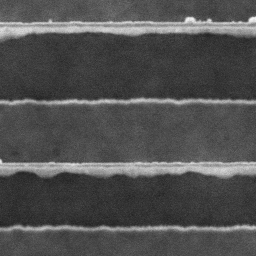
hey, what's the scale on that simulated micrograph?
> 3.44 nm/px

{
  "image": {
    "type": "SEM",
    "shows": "lines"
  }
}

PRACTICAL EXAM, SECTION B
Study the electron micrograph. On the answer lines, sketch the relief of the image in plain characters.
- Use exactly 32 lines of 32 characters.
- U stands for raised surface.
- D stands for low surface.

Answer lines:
UUUUUUUUUUUUUUUUUUUUUUUUUUUUUUUU
UUUUUUUUUUUUUUUUUUUUUUUUUUUUUUUU
UUUUUUUUUUUUUUUUUUUUUUUUUUUUUUUU
UUUUUUUUUUUUUUUUUUUUUUUUUUUUUUUU
DDDDDDDDDDDDDDDDDDDDDDDDDDDDDDDD
DDDDDDDDDDDDDDDDDDDDDDDDDDDDDDDD
DDDDDDDDDDDDDDDDDDDDDDDDDDDDDDDD
DDDDDDDDDDDDDDDDDDDDDDDDDDDDDDDD
DDDDDDDDDDDDDDDDDDDDDDDDDDDDDDDD
DDDDDDDDDDDDDDDDDDDDDDDDDDDDDDDD
DDDDDDDDDDDDDDDDDDDDDDDDDDDDDDDD
DDDDDDDDDDDDDDDDDDDDDDDDDDDDDDDD
DDDDDDDDDDDDDDDDDDDDDDDDDDDDDDDD
UUUUUUUUUUUUUUUUUUUUUUUUUUUUUUUU
UUUUUUUUUUUUUUUUUUUUUUUUUUUUUUUU
UUUUUUUUUUUUUUUUUUUUUUUUUUUUUUUU
UUUUUUUUUUUUUUUUUUUUUUUUUUUUUUUU
UUUUUUUUUUUUUUUUUUUUUUUUUUUUUUUU
UUUUUUUUUUUUUUUUUUUUUUUUUUUUUUUU
UUUUUUUUUUUUUUUUUUUUUUUUUUUUUUUU
UUUUUUUUUUUUUUUUUUUUUUUUUUUUUUUU
DDDDDDDDDDDDDDDDDDDDDDDDDDDDDDDD
DDDDDDDDDDDDDDDDDDDDDDDDDDDDDDDD
DDDDDDDDDDDDDDDDDDDDDDDDDDDDDDDD
DDDDDDDDDDDDDDDDDDDDDDDDDDDDDDDD
DDDDDDDDDDDDDDDDDDDDDDDDDDDDDDDD
DDDDDDDDDDDDDDDDDDDDDDDDDDDDDDDD
DDDDDDDDDDDDDDDDDDDDDDDDDDDDDDDD
DDUDDDDDDDDDDDDDDDDDDUDDDDDDDUUU
UUUUUUUUUUUUUUUUUUUUUUUUUUUUUUUU
UUUUUUUUUUUUUUUUUUUUUUUUUUUUUUUU
UUUUUUUUUUUUUUUUUUUUUUUUUUUUUUUU